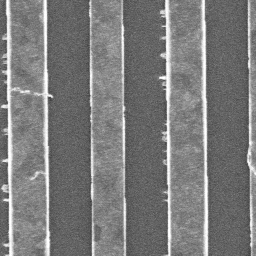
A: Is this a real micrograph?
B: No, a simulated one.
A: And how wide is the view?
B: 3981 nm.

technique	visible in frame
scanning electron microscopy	lines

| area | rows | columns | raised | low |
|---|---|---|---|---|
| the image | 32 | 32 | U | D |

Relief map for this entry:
DUUUUUDDDDDUUUUDDDDDDUUUUDDDDDDU
DUUUUUDDDDDUUUUDDDDDDUUUUDDDDDDU
DUUUUUDDDDDUUUUDDDDDDUUUUDDDDDDU
DUUUUUDDDDDUUUUDDDDDDUUUUDDDDDDU
DUUUUUDDDDDUUUUDDDDDDUUUUDDDDDDU
DUUUUUDDDDDUUUUDDDDDDUUUUDDDDDDU
DUUUUUDDDDDUUUUDDDDDDUUUUDDDDDDU
DUUUUUDDDDDUUUUDDDDDDUUUUDDDDDDU
DUUUUUDDDDDUUUUDDDDDDUUUUDDDDDDU
DUUUUUDDDDDUUUUDDDDDDUUUUUDDDDDU
DUUUUUDDDDDUUUUDDDDDDUUUUDDDDDDU
DUUUUUDDDDDUUUUDDDDDDUUUUUDDDDDU
DUUUUUDDDDDUUUUDDDDDDUUUUUDDDDDU
DUUUUUDDDDDUUUUDDDDDDUUUUUDDDDDU
DUUUUUDDDDDUUUUDDDDDDUUUUUDDDDDU
DUUUUUDDDDDUUUUDDDDDDUUUUUDDDDDU
DUUUUUDDDDDUUUUDDDDDDUUUUUDDDDDU
DUUUUUDDDDDUUUUDDDDDDUUUUUDDDDDU
DUUUUUDDDDDUUUUDDDDDDUUUUUDDDDDU
DUUUUUDDDDDUUUUDDDDDDUUUUUDDDDDU
DUUUUUDDDDDUUUUDDDDDDUUUUUDDDDDU
DUUUUUDDDDDUUUUDDDDDDUUUUUDDDDDU
DUUUUUDDDDDDUUUDDDDDDUUUUUDDDDDU
DUUUUUDDDDDUUUUDDDDDDUUUUUDDDDDU
DUUUUUDDDDDUUUUDDDDDDUUUUUDDDDDU
DUUUUUDDDDDDUUUDDDDDDUUUUUDDDDDU
DUUUUUDDDDDDUUUUDDDDDUUUUUDDDDDU
DUUUUUDDDDDDUUUUDDDDDUUUUUDDDDDU
DUUUUUDDDDDDUUUUDDDDDUUUUUDDDDDU
DUUUUUDDDDDDUUUUDDDDDUUUUUDDDDDU
DUUUUUDDDDDDUUUUDDDDDUUUUUDDDDDU
DUUUUUDDDDDDUUUUDDDDDUUUUUDDDDDU